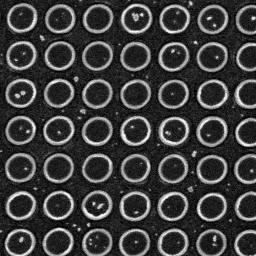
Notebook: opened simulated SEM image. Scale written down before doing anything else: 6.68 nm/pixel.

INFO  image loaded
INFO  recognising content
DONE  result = a regular array of raised bodies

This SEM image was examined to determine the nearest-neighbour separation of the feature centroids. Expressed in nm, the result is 249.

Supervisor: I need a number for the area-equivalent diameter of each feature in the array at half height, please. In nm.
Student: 185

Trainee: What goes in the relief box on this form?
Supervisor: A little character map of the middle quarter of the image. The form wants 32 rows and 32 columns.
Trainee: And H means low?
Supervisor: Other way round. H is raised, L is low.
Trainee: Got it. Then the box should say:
HLLLLLHHHHHLLLLHHHHHLLLLLHHHHHLL
LLLLLLLLLLLLLLLLLLLLLLLLLLLHLLLL
LLLLLLLLLLLLLLLLLLLLLLLLLLLLLLLL
LLLLLLLLLLLLLLLLLLLLLLLLLLLLLLLL
HLLLLLLHHHLLLLLLLHHHLLLLLLHHHLLL
HHLLLLHHHHHLLLLHHHHHHLLLLHHHHHLL
HHLLLHHHHHHHLLLHHHHHHLLLHHHHHHHL
HHLLLHHHHHHHLLLHHHHHHLLLHHHHHHHL
HHLLLHHHHHHHLLLHHHHHHLLLHHHHHHHL
HLLLLHHHHHHLLLLHHHHHHLLLHHHHHHLL
LLLLLLLHHLLLLLLLHHHLLLLLLHHHHLLL
LLLLLLLLLLLLLLLLLLLLLLLLLLLLLLLL
LLLLLLLLLLLLLLLLLLLLLLLLLLLLLLLL
LLLLLLLLLLLLLLLLLHHHLLLLLLLLLLLL
HHLLLLHHHHHLLLLHHHHHHLLLLHHHHHLL
HHLLLHHHHHHHLLLHHHHHHLLLHHHHHHHL
HHLLLHHHHHHHLLHHHHHHHLLLHHHHHHHL
HHLLLHHHHHHHLLHHHHHHHLLLHHHHHHHL
HLLLLHHHHHHLLLLHHHHHHLLLHHHHHHLL
LLLLLLHHHHLLLLLLHHHHLLLLLHHHHLLL
LLLLLLLLLLLLLLLLLLLLLLLLLLLLLLLL
LLLLLLLLLLLLLLLLLLLLLLLLLLLLLLLL
LLLLLLLLLLLLLLLLLLLLLLLLLLLLLLLL
HLLLLLHHHHHLLLLLHHHHLLLLLLHHHLLL
HHLLLLHHHHHHLLLHHHHHHLLLHHHHHHLL
HHLLLHHHHHHHLLLHHHHHHLLLHHHHHHHL
HHLLLHHHHHHHLLLHHHHHHLLLHHHHHHHL
HHLLLHHHHHHLLLLHHHHHHLLLHHHHHHLL
HLLLLLHHHHHLLLLHHHHHLLLLLHHHHHLL
LLLLLLLLLLLLLLLLLLLLLLLLLLLHLLLL
LLLLLLLLLLLLLLLLLLLLLLLLLLLLLLLL
LLLLLLLLLLLLLLLLLLLLLLLLLLLLLLLL